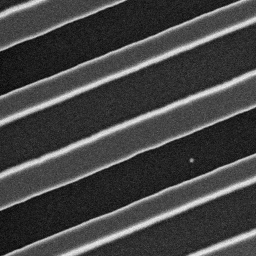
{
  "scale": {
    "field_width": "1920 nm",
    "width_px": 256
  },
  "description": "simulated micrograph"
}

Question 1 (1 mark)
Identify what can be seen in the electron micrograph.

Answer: lines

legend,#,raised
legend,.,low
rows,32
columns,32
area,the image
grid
....###########..............###
.###########..............######
#########...............########
#######..............########...
#####..............########.....
##..............########........
..............########..........
...........########.............
.........########...............
.......#######.................#
....########.................###
.########.................######
#######................#########
#####................###########
##................###########...
................###########.....
.............###########........
...........###########..........
.........##########.............
......###########..............#
....##########...............###
.###########..............######
##########..............########
#######..............########...
####...............########.....
##..............########........
..............########..........
...........########.............
.........########...............
.......#######.................#
....########................####
.########.................######